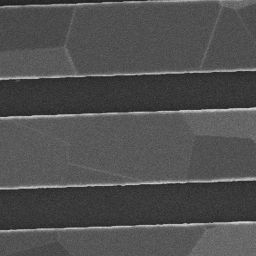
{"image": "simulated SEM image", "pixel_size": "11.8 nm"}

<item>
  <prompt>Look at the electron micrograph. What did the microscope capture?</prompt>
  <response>lines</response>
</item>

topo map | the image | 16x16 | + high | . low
++++++++++++++++
++++++++++++++++
++++++++++++++++
++++++++++++++++
++++++++++++++..
................
................
++++++++++++++++
++++++++++++++++
++++++++++++++++
++++++++++++++++
+++++++++.......
................
................
++++++++++++++++
++++++++++++++++